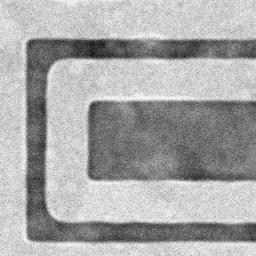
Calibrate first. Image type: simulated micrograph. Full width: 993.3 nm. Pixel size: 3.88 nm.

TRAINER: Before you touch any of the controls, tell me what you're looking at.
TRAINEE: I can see groups of lines, slits or small figures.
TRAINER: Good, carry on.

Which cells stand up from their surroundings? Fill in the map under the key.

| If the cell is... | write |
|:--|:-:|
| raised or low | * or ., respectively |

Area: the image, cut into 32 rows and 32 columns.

********************************
********************************
********************************
********************************
******************.*************
***.............................
***.............................
***.....**..******.....***...***
***....*************************
***...**************************
***...**************************
***...**************************
***...******....................
***...*****.....................
***...*****.....................
***...*****.....................
***...*****.....................
***...*****.....................
***...*****.....................
***...*****.....................
***...*****.....................
***...*****.....................
***...*****.....................
***...**************************
***...**************************
***...**************************
***...**************************
***....*************************
***.............................
***.............................
*******....*********************
********************************